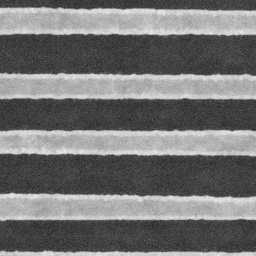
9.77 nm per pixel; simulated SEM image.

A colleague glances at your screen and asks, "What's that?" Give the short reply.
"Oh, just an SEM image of lines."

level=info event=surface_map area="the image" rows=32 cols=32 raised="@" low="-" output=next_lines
--------------------------------
@@@@@@@@@@@@@@@@@@@@@@@@@@@@@@@-
@@@@@@@@@@@@@@@@@@@@@@@@@@@@@@@@
@@@@@@@@@@@@@@@@@@@@@@@@@@@@@@@@
--------------------------------
--------------------------------
--------------------------------
--------------------------------
--------------------------------
@@@@@@@@@@@@@@@-@@@@--@@@-@@--@-
@@@@@@@@@@@@@@@@@@@@@@@@@@@@@@@@
@@@@@@@@@@@@@@@@@@@@@@@@@@@@@@@@
--------------------------------
--------------------------------
--------------------------------
--------------------------------
-@@@@@@@@@@@@@@@@@-@@@@@@@@@@@@@
@@@@@@@@@@@@@@@@@@@@@@@@@@@@@@@@
@@@@@@@@@@@@@@@@@@@@@@@@@@@@@@@@
--------------------------------
--------------------------------
--------------------------------
--------------------------------
--------------------------------
@@@@@@@@@@----------------------
@@@@@@@@@@@@@@@@@@@@@@@@@@@@@@@@
@@@@@@@@@@@@@@@@@@@@@@@@@@@@@@@@
--------------------------------
--------------------------------
--------------------------------
--------------------------------
--------------------------------